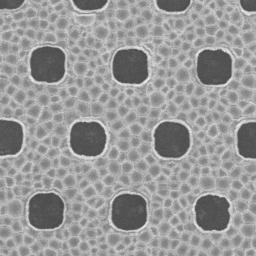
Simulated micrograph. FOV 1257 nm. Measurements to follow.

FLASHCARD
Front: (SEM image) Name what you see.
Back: a regular array of holes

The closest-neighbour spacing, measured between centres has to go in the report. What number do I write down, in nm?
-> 408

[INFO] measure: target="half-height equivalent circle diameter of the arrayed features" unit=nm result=188